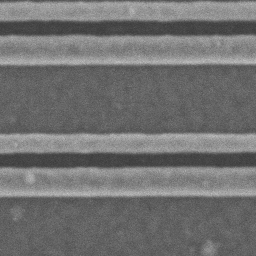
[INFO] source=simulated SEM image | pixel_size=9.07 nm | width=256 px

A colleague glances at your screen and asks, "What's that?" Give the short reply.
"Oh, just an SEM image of lines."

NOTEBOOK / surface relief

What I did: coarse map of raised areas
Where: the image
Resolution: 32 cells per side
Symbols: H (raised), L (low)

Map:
HHHHHHHHHHHHHHHHHHHHHHHHHHHHHHHH
HHHHHHHHHHHHHHHHHHHHHHHHHHHHHHHH
HHHHLHHHHHHHHHHHLHHHHHHLLHHHHHLH
LLLLLLLLLLLLLLLLLLLLLLLLLLLLLLLL
LHLLLLHLHHHHLLLLLLLLHHLLLLLHLHHH
HHHHHHHHHHHHHHHHHHHHHHHHHHHHHHHH
HHHHHHHHHHHHHHHHHHHHHHHHHHHHHHHH
HHHHHHHHHHHHHHHHHHHHHHHHHHHHHHHH
LLLLLLLLLLLLLLLLLLLLLLLLLLLLLLLL
LLLLLLLLLLLLLLLLLLLLLLLLLLLLLLLL
LLLLLLLLLLLLLLLLLLLLLLLLLLLLLLLL
LLLLLLLLLLLLLLLLLLLLLLLLLLLLLLLL
LLLLLLLLLLLLLLLLLLLLLLLLLLLLLLLL
LLLLLLLLLLLLLLLLLLLLLLLLLLLLLLLL
LLLLLLLLLLLLLLLLLLLLLLLLLLLLLLLL
LLLLLLLLLLLLLLLLLLLLLLLLLLLLLLLL
LLLLLLLLLLLLLLLLLLLLLLLLLLLLLLLL
HHHHHHHHHHHHHHHHHHHHHHHHHHHHHHHH
HHHHHHHHHHHHHHHHHHHHHHHHHHHHHHHH
LLLLLLLLLLLLLLLLLLLLLLLLLLLLLLLL
LLLLLLLLLLLLLLLLLLLLLLLLLLLLLLLL
HHHHHHHHHHHHHHHHHHHHHHHHHHHHHHHH
HHHHHHHHHHHHHHHHHHHHHHHHHHHHHHHH
HHHHHHHHHHHHHHHHHHHHHHHHHHHHHHHH
LLLLLLLLLLLLLLLLLLLLLLLLLLLLLLLL
LLLLLLLLLLLLLLLLLLLLLLLLLLLLLLLL
LLLLLLLLLLLLLLLLLLLLLLLLLLLLLLLL
LLLLLLLLLLLLLLLLLLLLLLLLLLLLLLLL
LLLLLLLLLLLLLLLLLLLLLLLLLLLLLLLL
LLLLLLLLLLLLLLLLLLLLLLLLLLLLLLLL
LLLLLLLLLLLLLLLLLLLLLLLLLLLLLLLL
LLLLLLLLLLLLLLLLLLLLLLLLLLLLLLLL